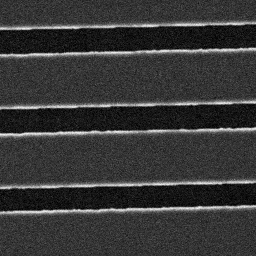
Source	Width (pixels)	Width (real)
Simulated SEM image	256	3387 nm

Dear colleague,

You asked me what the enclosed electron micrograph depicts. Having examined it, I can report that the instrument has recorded lines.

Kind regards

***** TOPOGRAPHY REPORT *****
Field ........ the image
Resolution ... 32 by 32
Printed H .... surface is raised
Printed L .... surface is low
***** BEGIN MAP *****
HHHHHHHHHHHHHHHHHHHHHHHHHHHHHHHH
HHHHHHHHHHHHHHHHHHHHHHHHHHHHHHHH
HHHHHHHHHHHHHHHHHHHHHHHHHHHHHHHH
HHHHHHHHHHLLLLLLLLLLLLLLLLLLLLLL
LLLLLLLLLLLLLLLLLLLLLLLLLLLLLLLL
LLLLLLLLLLLLLLLLLLLLLLLLLLLLLLLL
LLLLLLLLLLLLLLLLLHHHHHHHHHHHHHHH
HHHHHHHHHHHHHHHHHHHHHHHHHHHHHHHH
HHHHHHHHHHHHHHHHHHHHHHHHHHHHHHHH
HHHHHHHHHHHHHHHHHHHHHHHHHHHHHHHH
HHHHHHHHHHHHHHHHHHHHHHHHHHHHHHHH
HHHHHHHHHHHHHHHHHHHHHHHHHHHHHHHH
HHHHHHHHHHHHHHHHHHHHHHHHHHHHHHHH
HHHHHLLLLLLLLLLLLLLLLLLLLLLLLLLL
LLLLLLLLLLLLLLLLLLLLLLLLLLLLLLLL
LLLLLLLLLLLLLLLLLLLLLLLLLLLLLLLL
LLLLLLLLLLLHHHHHHHHHHHHHHHHHHHHH
HHHHHHHHHHHHHHHHHHHHHHHHHHHHHHHH
HHHHHHHHHHHHHHHHHHHHHHHHHHHHHHHH
HHHHHHHHHHHHHHHHHHHHHHHHHHHHHHHH
HHHHHHHHHHHHHHHHHHHHHHHHHHHHHHHH
HHHHHHHHHHHHHHHHHHHHHHHHHHHHHHHH
HHHHHHHHHHHHHHHHHHHHHHHHHHHHHHHH
HHLLLLLLLLLLLLLLLLLLLLLLLLLLLLLL
LLLLLLLLLLLLLLLLLLLLLLLLLLLLLLLL
LLLLLLLLLLLLLLLLLLLLLLLLLLLLLLLL
LHHHHHHHHHHHHHHHHHHHHHHHHHHHHHHH
HHHHHHHHHHHHHHHHHHHHHHHHHHHHHHHH
HHHHHHHHHHHHHHHHHHHHHHHHHHHHHHHH
HHHHHHHHHHHHHHHHHHHHHHHHHHHHHHHH
HHHHHHHHHHHHHHHHHHHHHHHHHHHHHHHH
HHHHHHHHHHHHHHHHHHHHHHHHHHHHHHHH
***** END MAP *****